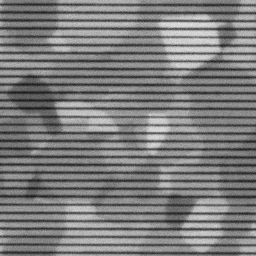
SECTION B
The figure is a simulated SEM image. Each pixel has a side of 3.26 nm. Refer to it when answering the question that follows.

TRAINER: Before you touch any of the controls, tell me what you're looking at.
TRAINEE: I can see parallel lines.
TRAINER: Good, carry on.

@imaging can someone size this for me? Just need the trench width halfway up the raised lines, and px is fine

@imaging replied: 2.64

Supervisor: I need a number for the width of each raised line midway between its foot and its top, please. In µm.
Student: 0.0171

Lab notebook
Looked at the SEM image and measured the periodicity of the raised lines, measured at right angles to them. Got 26.1 nm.